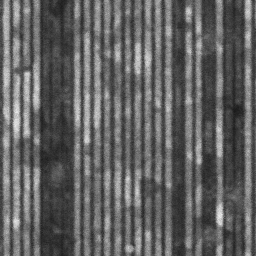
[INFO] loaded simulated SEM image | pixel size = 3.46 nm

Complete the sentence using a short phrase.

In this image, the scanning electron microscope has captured parallel lines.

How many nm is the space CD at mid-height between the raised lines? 16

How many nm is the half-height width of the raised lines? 19.1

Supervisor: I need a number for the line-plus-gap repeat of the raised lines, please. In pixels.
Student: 10.1